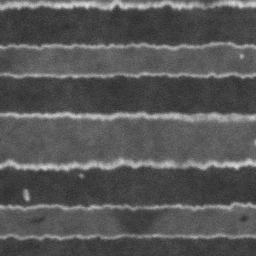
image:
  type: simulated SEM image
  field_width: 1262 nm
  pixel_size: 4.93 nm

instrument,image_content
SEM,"lines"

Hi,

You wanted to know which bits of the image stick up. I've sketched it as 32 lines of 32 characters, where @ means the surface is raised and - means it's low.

@@@@@@@@@@@@@@-@@@@@@@@@@@@@-@@@
--------------------------------
--------------------------------
--------------------------------
--------------------------------
---------------------------@@---
@@@@@@@@@@@@@@@@@@@@@@@@@@@@@@@@
@@@@@@@@@@@@@@@@@@@@@@@@@@@@@@@@
@@@@@@@@@@@@@@@@@@@@@@@@@@@@@@@@
-@@@@@@@@@@@@@--@@---@--@@@@@-@@
--------------------------------
--------------------------------
--------------------------------
--------------------------------
@@@@@@-@@-@@--@@@@--@@----------
@@@@@@@@@@@@@@@@@@@@@@@@@@@@@@@@
@@@@@@@@@@@@@@@@@@@@@@@@@@@@@@@@
@@@@@@@@@@@@@@@@@@@@@@@@@@@@@@@@
@@@@@@@@@@@@@@@@@@@@@@@@@@@@@@@@
@@@@@@@@@@@@@@@@@@@@@@@@@@@@@@@@
@@@@@@@@@@@@@@@-@@@@@@@@@@@@@@@-
--------------------------------
--------------------------------
--------------------------------
--------------------------------
-----------------------------@--
@@@@@@@@@@@@@@@@@@@@@@@@@@@@@@@@
@@@@@@@@@@@@@@@@@@@@@@@@@@@@@@@@
@@@@@@@@@@@@@@@@@@@@@@@@@@@@@@@@
@@@@@@@@@@@@@@@@@@@@@@@@@@@@@@@@
--------------------------------
--------------------------------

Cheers